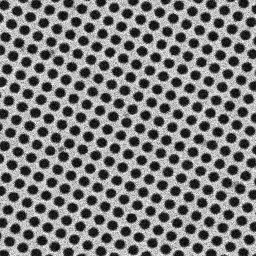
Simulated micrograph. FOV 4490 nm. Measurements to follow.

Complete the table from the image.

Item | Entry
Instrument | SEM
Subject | a regular array of holes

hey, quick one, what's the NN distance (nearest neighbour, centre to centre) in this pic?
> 14.2 pixels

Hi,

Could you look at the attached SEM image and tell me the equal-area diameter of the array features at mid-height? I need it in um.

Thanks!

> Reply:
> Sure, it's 0.197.